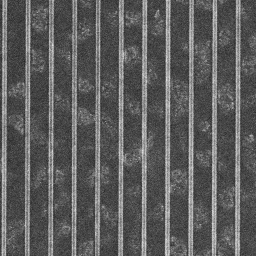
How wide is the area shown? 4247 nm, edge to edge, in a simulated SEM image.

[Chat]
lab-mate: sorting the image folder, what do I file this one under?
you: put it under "parallel lines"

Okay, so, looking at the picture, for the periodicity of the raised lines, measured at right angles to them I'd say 23.3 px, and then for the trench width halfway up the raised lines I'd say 344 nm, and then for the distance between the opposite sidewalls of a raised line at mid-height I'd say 43.5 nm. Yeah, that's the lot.